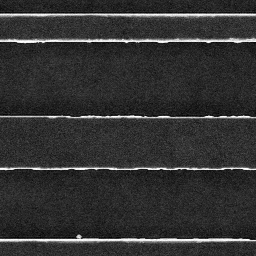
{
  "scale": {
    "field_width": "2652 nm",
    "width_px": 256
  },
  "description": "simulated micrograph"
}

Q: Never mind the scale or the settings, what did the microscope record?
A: lines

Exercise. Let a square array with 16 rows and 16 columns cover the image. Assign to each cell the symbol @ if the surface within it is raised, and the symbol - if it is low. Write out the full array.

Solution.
----------------
@@@@@@@@@@@@@@@@
@@@@@@@@@@@@@@@@
----------------
----------------
----------------
----------------
@@@@@@@@@@@@@@@@
@@@@@@@@@@@@@@@@
@@@@@@@@@@@@@@@@
@@@@@@@@@@@@@@@@
----------------
----------------
----------------
----------------
@@@@@@@@@@@@@@@@